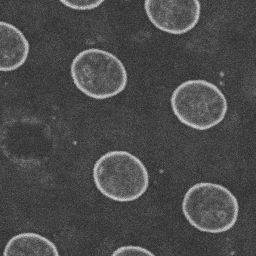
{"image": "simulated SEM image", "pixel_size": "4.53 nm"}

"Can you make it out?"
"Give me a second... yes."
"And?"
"raised bodies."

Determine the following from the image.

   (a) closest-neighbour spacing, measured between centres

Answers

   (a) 451 nm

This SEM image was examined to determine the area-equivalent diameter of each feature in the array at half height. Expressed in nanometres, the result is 225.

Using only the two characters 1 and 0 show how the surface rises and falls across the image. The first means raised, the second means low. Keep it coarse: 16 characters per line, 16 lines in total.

0000000001110000
0000000000110000
1100000000000000
1100011000000000
0000011100000000
0000011100011000
0000000000011100
0000000000011100
0000000000000000
0000000000000000
0000001110000000
0000001110000000
0000000000001110
0000000000001110
0000000000000000
1110000000000000